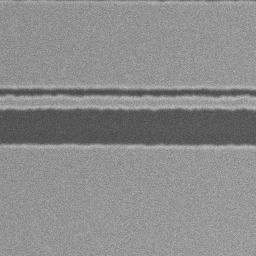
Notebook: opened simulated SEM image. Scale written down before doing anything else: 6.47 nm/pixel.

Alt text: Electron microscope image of lines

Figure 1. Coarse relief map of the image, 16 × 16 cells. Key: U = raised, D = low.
UUUUUUUUUUUUUUUU
UUUUUUUUUUUUUUUU
UUUUUUUUUUUUUUUU
UUUUUUUUUUUUUUUU
UUUUUUUUUUUUUUUU
UUUUUUUUUUUUUUUU
UUUUUUUUUUUUUUUU
DDDDDDDDDDDDDDDD
DDDDDDDDDDDDDDDD
UUUUUUUUUUUUUUUU
UUUUUUUUUUUUUUUU
UUUUUUUUUUUUUUUU
UUUUUUUUUUUUUUUU
UUUUUUUUUUUUUUUU
UUUUUUUUUUUUUUUU
UUUUUUUUUUUUUUUU